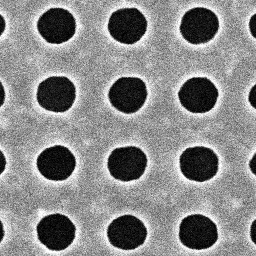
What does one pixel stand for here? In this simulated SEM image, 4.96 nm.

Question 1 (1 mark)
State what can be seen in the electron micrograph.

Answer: a regular array of holes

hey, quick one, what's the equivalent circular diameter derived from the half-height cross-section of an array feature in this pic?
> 188 nanometres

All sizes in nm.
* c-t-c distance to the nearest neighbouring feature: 341